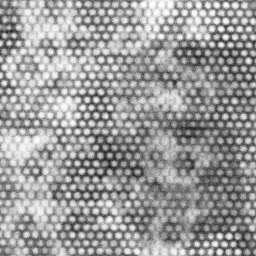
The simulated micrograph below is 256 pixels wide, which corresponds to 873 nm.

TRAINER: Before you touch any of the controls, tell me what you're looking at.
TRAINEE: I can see a regular array of raised bodies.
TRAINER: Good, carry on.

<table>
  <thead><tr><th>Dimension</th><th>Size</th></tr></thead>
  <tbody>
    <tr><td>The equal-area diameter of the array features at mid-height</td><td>17.6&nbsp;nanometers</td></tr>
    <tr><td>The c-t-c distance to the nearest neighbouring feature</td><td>30.2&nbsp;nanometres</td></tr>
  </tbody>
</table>